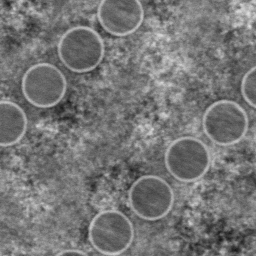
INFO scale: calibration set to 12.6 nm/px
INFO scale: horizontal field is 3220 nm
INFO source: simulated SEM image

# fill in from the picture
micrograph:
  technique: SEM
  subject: raised bodies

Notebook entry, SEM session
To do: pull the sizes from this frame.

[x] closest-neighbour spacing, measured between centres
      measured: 658 nanometers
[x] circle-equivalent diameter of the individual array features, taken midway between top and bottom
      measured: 0.541 microns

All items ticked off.